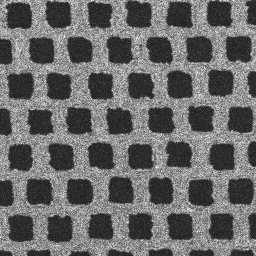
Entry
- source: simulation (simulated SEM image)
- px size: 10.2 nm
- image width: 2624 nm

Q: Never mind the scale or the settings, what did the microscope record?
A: a regular array of holes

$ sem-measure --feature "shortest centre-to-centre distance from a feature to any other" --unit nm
402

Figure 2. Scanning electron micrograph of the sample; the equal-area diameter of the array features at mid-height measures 286 nanometers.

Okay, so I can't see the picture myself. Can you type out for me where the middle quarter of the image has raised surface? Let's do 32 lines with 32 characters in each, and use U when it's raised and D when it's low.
UUUUUUUUUUUUUUUUUUUUUUUUUUUUUUUU
UUUUUUUUUUUUUUUUUUUUUUUUUUUUUUUU
DUUUUUUDDDDUUUUUDDDDDUUUUUDDDDDU
DDUUUUDDDDDDUUUUDDDDDDUUUUDDDDDD
DDUUUUDDDDDDUUUUDDDDDDUUUUDDDDDD
DDUUUUDDDDDDUUUUDDDDDDDUUUDDDDDD
DDUUUUDDDDDDUUUUDDDDDDUUUUDDDDDD
DDUUUUUDDDDDUUUUDDDDDDUUUUDDDDDD
DDUUUUUDDDDDUUUUUDDUUDUUUUUDDDDU
UUUUUUUUUUUUUUUUUUUUUUUUUUUUUUUU
UUUUUUUUUUUUUUUUUUUUUUUUUUUUUUUU
UDDDDDDUUUUDDDDDUUUUUDDDDDDUUUUD
UDDDDDDUUUUDDDDDDUUUUDDDDDDUUUUD
UDDDDDDUUUDDDDDDDUUUUDDDDDDUUUUD
UDDDDDDUUUUDDDDDDUUUUDDDDDDUUUUD
UDDDDDDUUUUDDDDDDUUUUDDDDDDDUUUU
UDDDDDDUUUUDDDDDDUUUUUDDDDDUUUUU
UUDDDUUUUUUUDDDDUUUUUUUUUUUUUUUU
UUUUUUUUUUUUUUUUUUUUUUUUUUUUUUUU
UUUUUUUUUUUUUUUUUUUUUUUUUUDDDDUU
DDUUUUDDDDDDUUUUDDDDDDUUUUDDDDDD
DDUUUUDDDDDDUUUUDDDDDDUUUDDDDDDD
DDDUUUDDDDDDDUUUDDDDDDUUUUDDDDDD
DDUUUUDDDDDDUUUUDDDDDDUUUUDDDDDD
DDUUUUDDDDDDUUUUDDDDDDUUUUDDDDDD
DDDUUUDDDDDDUUUUDDDDDDUUUUDDDDDD
DUUUUUUUUUUUUUUUUUUDUUUUUUUUUUUU
UUUUUUUUUUUUUUUUUUUUUUUUUUUUUUUU
UUUUUUUUUUUUDDDDUUUUUUDUUDUUUUUU
UDDDDDDUUUUDDDDDDUUUUDDDDDDUUUUD
UDDDDDDUUUUDDDDDDUUUUDDDDDDUUUUD
UDDDDDDUUUUDDDDDDUUUUDDDDDDUUUUD